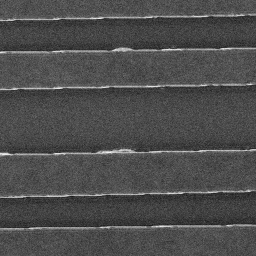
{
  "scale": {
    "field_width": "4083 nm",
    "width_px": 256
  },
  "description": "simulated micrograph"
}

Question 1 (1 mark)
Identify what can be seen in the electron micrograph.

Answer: lines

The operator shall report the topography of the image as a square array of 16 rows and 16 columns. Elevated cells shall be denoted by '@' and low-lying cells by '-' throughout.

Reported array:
@@@@@@@@@@@@@@@@
----------------
----------------
@@@@@@@@@@@@@@@@
@@@@@@@@@@@@@@@@
@@@@------------
----------------
----------------
----------------
---------@@@@@@@
@@@@@@@@@@@@@@@@
@@@@@@@@@@@@@@@@
----------------
----------------
@@@@@@@@@@@@@@@@
@@@@@@@@@@@@@@@@